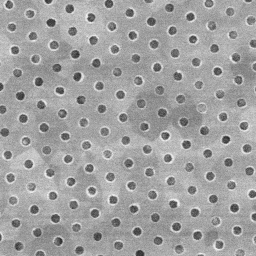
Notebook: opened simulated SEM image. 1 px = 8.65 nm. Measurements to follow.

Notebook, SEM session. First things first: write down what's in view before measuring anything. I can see a regular array of holes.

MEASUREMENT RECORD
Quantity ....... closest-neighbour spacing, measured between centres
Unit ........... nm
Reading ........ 195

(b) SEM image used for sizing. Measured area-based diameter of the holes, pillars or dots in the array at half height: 81.1 nm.